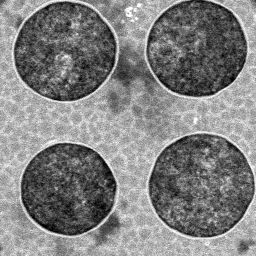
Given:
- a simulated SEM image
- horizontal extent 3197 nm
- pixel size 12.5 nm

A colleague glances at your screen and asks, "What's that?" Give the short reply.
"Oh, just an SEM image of holes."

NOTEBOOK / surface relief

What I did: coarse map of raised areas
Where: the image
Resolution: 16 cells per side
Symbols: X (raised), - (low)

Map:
XXX---XXXXX---XX
X------XXX-----X
X------XX------X
X------XX------X
X------XXX-----X
XX----XXXX----XX
XXXXXXXXXXXXXXXX
XXXXXXXXXXXXXXXX
XXXXXXXXXXXX--XX
XX----XXXX-----X
XX-----XXX------
X------XX-------
X------XX-------
XX-----XXX-----X
XXX--XXXXXX---XX
XXXXXXXXXXXXXXXX